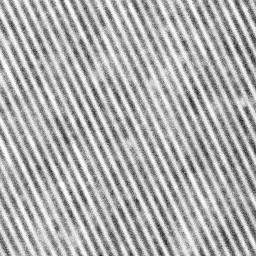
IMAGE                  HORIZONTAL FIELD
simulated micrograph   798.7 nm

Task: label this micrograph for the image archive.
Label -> parallel lines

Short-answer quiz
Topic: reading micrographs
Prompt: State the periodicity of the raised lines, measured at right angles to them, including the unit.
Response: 9.26 px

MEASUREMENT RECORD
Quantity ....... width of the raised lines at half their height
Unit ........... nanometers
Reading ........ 6.3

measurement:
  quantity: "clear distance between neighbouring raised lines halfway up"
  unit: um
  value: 0.0212